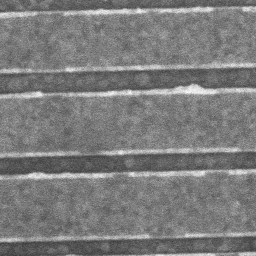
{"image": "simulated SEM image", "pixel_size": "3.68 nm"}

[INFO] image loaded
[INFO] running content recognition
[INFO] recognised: one or a few lines or trenches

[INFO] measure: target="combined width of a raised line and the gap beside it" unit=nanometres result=305